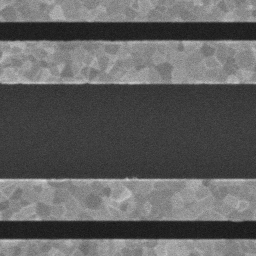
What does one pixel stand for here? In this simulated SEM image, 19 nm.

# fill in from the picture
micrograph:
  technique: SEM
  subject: lines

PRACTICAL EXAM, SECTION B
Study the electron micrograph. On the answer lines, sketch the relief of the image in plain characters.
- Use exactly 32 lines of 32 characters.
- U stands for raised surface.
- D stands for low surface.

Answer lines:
UUUUUUUUUUUUUUUUUUUUUUUUUUUUUUUU
UUUUUUUUUUUUUUUUUUUUUUUUUUUUUUUU
UUUUUUUUUUUUUUUUUUUUUUUUUUUUUUUU
DDDDDDDDDDDDDDDDDDDDDDDDDDDDDDDD
DDDDDDDDDDDDDDDDDDDDDDDDDDDDDDDD
UUUUUUUUUUUUUUUUUUUUUUUUUUUUUUUU
UUUUUUUUUUUUUUUUUUUUUUUUUUUUUUUU
UUUUUUUUUUUUUUUUUUUUUUUUUUUUUUUU
UUUUUUUUUUUUUUUUUUUUUUUUUUUUUUUU
UUUUUUUUUUUUUUUUUUUUUUUUUUUUUUUU
DDDDDDDDDDDDDDDDDDDDDDDDDDDDDDDD
DDDDDDDDDDDDDDDDDDDDDDDDDDDDDDDD
DDDDDDDDDDDDDDDDDDDDDDDDDDDDDDDD
DDDDDDDDDDDDDDDDDDDDDDDDDDDDDDDD
DDDDDDDDDDDDDDDDDDDDDDDDDDDDDDDD
DDDDDDDDDDDDDDDDDDDDDDDDDDDDDDDD
DDDDDDDDDDDDDDDDDDDDDDDDDDDDDDDD
DDDDDDDDDDDDDDDDDDDDDDDDDDDDDDDD
DDDDDDDDDDDDDDDDDDDDDDDDDDDDDDDD
DDDDDDDDDDDDDDDDDDDDDDDDDDDDDDDD
DDDDDDDDDDDDDDDDDDDDDDDDDDDDDDDD
DDDDDDDDDDDDDDDDDDDDDDDDDDDDDDDD
DDUUDDDDUUUUUUUUUUUUUUUUUUUUUUUU
UUUUUUUUUUUUUUUUUUUUUUUUUUUUUUUU
UUUUUUUUUUUUUUUUUUUUUUUUUUUUUUUU
UUUUUUUUUUUUUUUUUUUUUUUUUUUUUUUU
UUUUUUUUUUUUUUUUUUUUUUUUUUUUUUUU
UUUUUUUUUUUUUUUUUUUUUUUUUUUUUUUU
DDDDDDDDDDDDDDDDDDDDDDDDDDDDDDDD
DDDDDDDDDDDDDDDDDDDDDDDDDDDDDDDD
UUUUUUUUUUUUUUUUUUUUUUUUUUUUUUUU
UUUUUUUUUUUUUUUUUUUUUUUUUUUUUUUU